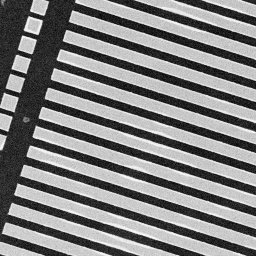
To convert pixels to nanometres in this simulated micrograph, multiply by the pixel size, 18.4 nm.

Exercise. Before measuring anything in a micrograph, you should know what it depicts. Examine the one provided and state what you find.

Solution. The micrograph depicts groups of lines, slits or small figures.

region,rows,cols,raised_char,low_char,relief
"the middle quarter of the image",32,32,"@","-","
---@@@@@@@@@-------@@@@@@@@@@---
------@@@@@@@@@@-------@@@@@@@@@
@--------@@@@@@@@@--------@@@@@@
@@@@@--------@@@@@@@@@-------@@@
@@@@@@@@-------@@@@@@@@@@-------
--@@@@@@@@@-------@@@@@@@@@@----
------@@@@@@@@@-------@@@@@@@@@@
@-------@@@@@@@@@@-------@@@@@@@
@@@@-------@@@@@@@@@@-------@@@@
@@@@@@@--------@@@@@@@@@-------@
-@@@@@@@@@--------@@@@@@@@@-----
----@@@@@@@@@@-------@@@@@@@@@@-
-------@@@@@@@@@@-------@@@@@@@@
@@@-------@@@@@@@@@@-------@@@@@
@@@@@@@-------@@@@@@@@@--------@
@@@@@@@@@--------@@@@@@@@@------
---@@@@@@@@@--------@@@@@@@@@---
-------@@@@@@@@---------@@@@@@@@
@@--------@@@@@@@@---------@@@@@
@@@@@@-------@@@@@@@@@--------@@
@@@@@@@@@-------@@@@@@@@@-------
--@@@@@@@@@@-------@@@@@@@@@----
------@@@@@@@@@--------@@@@@@@@@
@--------@@@@@@@@@--------@@@@@@
@@@@--------@@@@@@@@---------@@@
@@@@@@@@--------@@@@@@@@@-------
--@@@@@@@@@--------@@@@@@@@-----
-----@@@@@@@@@--------@@@@@@@@--
--------@@@@@@@@---------@@@@@@@
@@@--------@@@@@@@@@--------@@@@
@@@@@@@-------@@@@@@@@@@-------@
@@@@@@@@@@-------@@@@@@@@@@-----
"